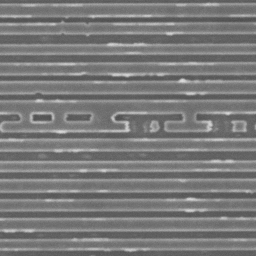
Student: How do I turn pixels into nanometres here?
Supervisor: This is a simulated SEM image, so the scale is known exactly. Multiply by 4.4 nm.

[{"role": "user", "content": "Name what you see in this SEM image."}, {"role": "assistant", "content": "parallel lines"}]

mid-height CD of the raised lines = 52.8 nm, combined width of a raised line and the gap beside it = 85.8 nm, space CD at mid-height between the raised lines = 0.0308 um